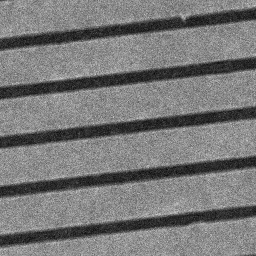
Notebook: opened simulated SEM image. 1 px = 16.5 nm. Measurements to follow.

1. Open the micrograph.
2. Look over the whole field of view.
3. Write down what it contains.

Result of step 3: parallel lines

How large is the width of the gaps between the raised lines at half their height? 225 nanometers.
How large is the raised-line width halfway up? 582 nm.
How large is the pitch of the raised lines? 48.9 px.